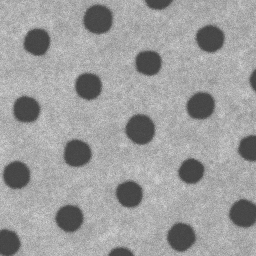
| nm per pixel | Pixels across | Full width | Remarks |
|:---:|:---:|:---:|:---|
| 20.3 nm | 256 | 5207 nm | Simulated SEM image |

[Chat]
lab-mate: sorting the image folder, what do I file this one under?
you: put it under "a regular array of holes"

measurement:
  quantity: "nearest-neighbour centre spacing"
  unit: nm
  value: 1320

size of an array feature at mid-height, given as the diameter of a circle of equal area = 565 nanometres